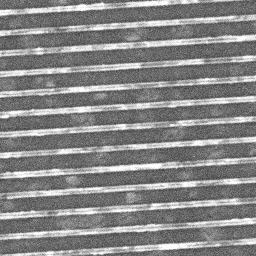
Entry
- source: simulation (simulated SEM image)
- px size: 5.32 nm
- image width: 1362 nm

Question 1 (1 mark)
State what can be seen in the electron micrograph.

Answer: parallel lines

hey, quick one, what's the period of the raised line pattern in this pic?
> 108 nm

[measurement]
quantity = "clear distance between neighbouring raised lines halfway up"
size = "81.7 nanometers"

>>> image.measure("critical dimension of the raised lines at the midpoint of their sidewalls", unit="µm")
0.0252